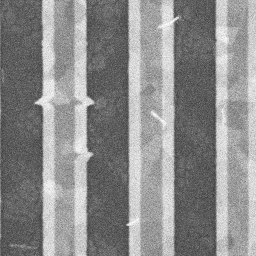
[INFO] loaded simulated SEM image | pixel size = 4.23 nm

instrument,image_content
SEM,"one or a few lines or trenches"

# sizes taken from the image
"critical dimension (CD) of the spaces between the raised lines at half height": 221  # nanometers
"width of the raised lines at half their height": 34.4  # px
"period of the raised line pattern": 86.7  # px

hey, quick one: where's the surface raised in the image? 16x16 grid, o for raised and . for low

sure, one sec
...oo...oo....oo
...oo...ooo...oo
...oo...oo....oo
...oo...oo....oo
...oo...ooo...oo
...oo...ooo...oo
...oo...ooo...oo
...oo...ooo...oo
...oo...ooo...oo
...oo...ooo...oo
...oo...ooo...oo
...oo...ooo...oo
...oo...ooo...oo
...oo...ooo...oo
...oo...ooo...oo
...oo...ooo...oo